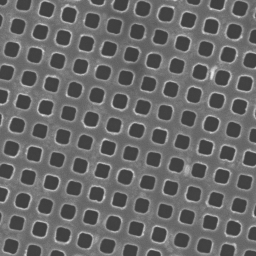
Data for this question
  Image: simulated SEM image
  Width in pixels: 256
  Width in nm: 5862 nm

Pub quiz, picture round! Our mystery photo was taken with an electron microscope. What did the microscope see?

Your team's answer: a regular array of holes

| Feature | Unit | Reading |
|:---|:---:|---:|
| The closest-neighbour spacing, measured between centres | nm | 531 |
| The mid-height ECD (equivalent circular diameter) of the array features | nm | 353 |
